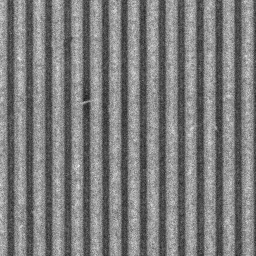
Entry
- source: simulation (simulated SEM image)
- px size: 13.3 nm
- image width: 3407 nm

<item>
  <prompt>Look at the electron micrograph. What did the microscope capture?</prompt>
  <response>parallel lines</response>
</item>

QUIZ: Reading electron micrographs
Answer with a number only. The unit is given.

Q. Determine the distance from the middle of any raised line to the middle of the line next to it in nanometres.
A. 252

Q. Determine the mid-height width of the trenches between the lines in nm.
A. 105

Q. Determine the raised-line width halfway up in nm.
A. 150